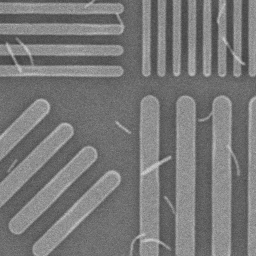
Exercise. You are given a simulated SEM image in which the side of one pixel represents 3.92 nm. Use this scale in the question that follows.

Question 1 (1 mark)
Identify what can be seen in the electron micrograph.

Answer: groups of lines, slits or small figures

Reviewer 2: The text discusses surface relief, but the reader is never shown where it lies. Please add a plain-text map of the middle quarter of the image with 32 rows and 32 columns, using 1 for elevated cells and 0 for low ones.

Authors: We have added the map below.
00000000000000000000100010011001
11111111111111100000100010011001
11111111111111100000100010001000
00000000000000000000000000000000
00000000000000000000000000000000
00000000000000000000000000000000
00000000000000000000000000000000
00000000000000000000000000000000
00000000000000000000111000000111
00000000000000000001111100001111
00000000000000000001111100001111
00000000000000000001111100001111
00000000000000000001111100001111
00000000000000000001111100001111
00000000000000000001111100001111
11000000000000000001111100001111
11000000000000000001111100001111
11000000000000000001111100001111
10000000000000000001111100001111
00000000000000000001111100001111
00000000000000000001111100001111
00001111000000000001111100001111
00001111000000000001111100001111
00011111000000000001111100001111
01111110000000000001111110001111
11111100000000000001111100001111
11111000000000000001111000001111
11110000000110000001111000001111
11100000001111000001111100001111
11000000011111000001111100001111
10000001111110000001111100001111
00000011111100000001111100001111